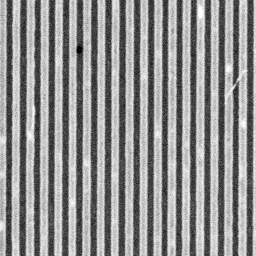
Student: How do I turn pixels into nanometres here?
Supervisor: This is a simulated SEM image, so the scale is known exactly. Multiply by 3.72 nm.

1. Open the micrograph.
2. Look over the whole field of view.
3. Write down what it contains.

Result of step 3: parallel lines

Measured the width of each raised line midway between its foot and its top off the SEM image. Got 0.026 µm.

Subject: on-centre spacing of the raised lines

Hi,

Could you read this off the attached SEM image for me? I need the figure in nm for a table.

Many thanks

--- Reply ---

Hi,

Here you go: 52.7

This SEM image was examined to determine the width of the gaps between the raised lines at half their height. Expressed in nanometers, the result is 26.